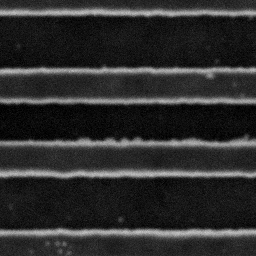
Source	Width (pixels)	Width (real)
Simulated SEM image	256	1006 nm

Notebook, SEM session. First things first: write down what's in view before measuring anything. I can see lines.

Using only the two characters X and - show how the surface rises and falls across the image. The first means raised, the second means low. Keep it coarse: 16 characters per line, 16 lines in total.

XXXXXXXXXXXXXXXX
----------------
----------------
----------------
XXXXXXXXXXXXXXXX
XXXXXXXXXXXXXXXX
----------------
----------------
----------------
XXXXXXXXXXXXXXXX
XXXXXXXXXXXXXXXX
----------------
----------------
----------------
XXXXXXXXXXXXXXXX
XXXXXXXXXXXXXXXX